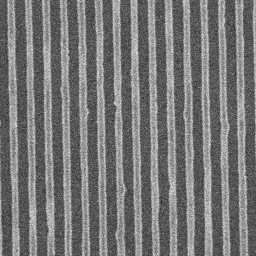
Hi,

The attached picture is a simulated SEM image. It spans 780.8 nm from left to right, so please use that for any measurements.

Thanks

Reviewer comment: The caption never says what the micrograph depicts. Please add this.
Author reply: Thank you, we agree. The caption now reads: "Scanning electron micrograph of parallel lines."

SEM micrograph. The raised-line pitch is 53.5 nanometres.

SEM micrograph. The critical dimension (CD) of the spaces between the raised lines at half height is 34.7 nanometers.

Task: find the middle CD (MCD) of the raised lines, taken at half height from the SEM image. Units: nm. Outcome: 19.4